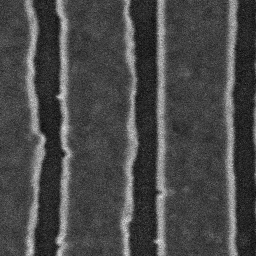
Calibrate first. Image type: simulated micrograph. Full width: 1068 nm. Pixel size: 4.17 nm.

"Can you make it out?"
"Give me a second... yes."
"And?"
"one or a few lines or trenches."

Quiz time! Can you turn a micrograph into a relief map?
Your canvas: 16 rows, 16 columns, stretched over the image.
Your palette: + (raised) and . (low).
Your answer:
++..++++..+++++.
++..++++..+++++.
++..++++..+++++.
++..++++..++++..
++..++++..++++..
++..++++..++++..
++..++++..++++..
++..++++..++++..
+++.++++..++++..
+++.++++..++++..
++..++++..++++..
++..++++..++++..
++..++++..++++..
++..++++..+++++.
++..++++..+++++.
++..++++..+++++.